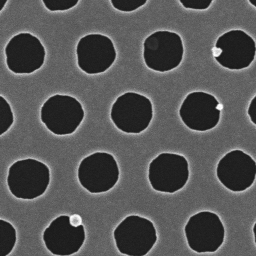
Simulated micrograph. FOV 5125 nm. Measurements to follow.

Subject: a regular array of holes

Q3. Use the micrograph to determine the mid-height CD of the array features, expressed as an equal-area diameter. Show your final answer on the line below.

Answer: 0.812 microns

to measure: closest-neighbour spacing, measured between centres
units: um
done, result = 1.37